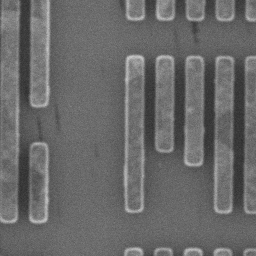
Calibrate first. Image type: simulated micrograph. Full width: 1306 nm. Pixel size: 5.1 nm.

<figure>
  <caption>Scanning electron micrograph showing groups of lines, slits or small figures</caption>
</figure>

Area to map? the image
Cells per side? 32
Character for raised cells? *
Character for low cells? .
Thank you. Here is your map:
**..**..........**..**.**..**..*
**..**..........**..**.**..**..*
**..**.........................*
**..**..........................
**..**..........................
**..**..........................
**..**..........................
**..**..........**..*...*..**..*
**..**..........**..**.**..**..*
**..**..........**..**.**..**..*
**..**..........**..**.**..**..*
**..**..........**..**.**..**..*
**..**..........**..**.**..**..*
**..............**..**.**..**..*
**..............**..**.**..**..*
**..............**..**.**..**..*
**..............**..**.**..**..*
**..............**..**.**..**..*
**..**..........**..**.**..**..*
**..**..........**.....**..**..*
**..**..........**......*..**..*
**..**..........**.........**..*
**..**..........**.........**..*
**..**..........**.........**..*
**..**..........**.........**..*
**..**..........**.........**..*
**..**.....................*...*
**..**..........................
................................
................................
................................
................**..*..**..**..*